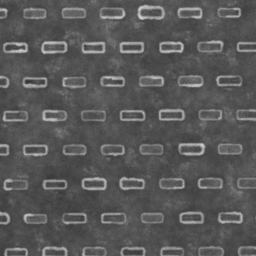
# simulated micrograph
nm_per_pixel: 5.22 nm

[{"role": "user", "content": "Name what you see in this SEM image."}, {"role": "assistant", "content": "a regular array of raised bodies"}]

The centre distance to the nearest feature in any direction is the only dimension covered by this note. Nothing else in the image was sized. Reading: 38.6 pixels